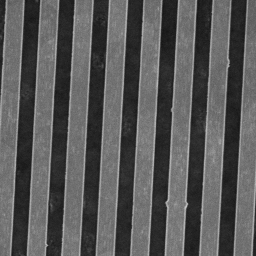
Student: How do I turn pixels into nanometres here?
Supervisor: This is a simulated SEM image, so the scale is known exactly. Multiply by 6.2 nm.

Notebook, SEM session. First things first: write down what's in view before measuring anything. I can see parallel lines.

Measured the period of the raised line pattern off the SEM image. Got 0.213 um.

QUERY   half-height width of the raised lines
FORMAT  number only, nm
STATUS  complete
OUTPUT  109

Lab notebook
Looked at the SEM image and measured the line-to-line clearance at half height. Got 0.103 µm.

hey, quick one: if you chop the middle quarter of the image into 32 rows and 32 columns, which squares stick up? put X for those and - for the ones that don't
--XXXX-----XXXX----XXXXX----XXXX
--XXXX-----XXXX----XXXX-----XXXX
--XXXX----XXXXX----XXXX-----XXXX
--XXXX----XXXXX----XXXX-----XXXX
--XXXX----XXXXX----XXXX-----XXXX
--XXXX----XXXXX----XXXX-----XXXX
--XXXX----XXXXX----XXXX-----XXXX
--XXXX----XXXXX----XXXX-----XXXX
--XXXX----XXXXX----XXXX----XXXXX
--XXXX----XXXX-----XXXX----XXXXX
-XXXXX----XXXX-----XXXX----XXXXX
-XXXXX----XXXX-----XXXX----XXXX-
-XXXXX----XXXX-----XXXX----XXXX-
-XXXXX----XXXX-----XXXX----XXXX-
-XXXXX----XXXX-----XXXX----XXXX-
-XXXXX----XXXX-----XXXX----XXXX-
-XXXXX----XXXX----XXXXX----XXXX-
-XXXX-----XXXX----XXXXX----XXXX-
-XXXX-----XXXX----XXXXX----XXXX-
-XXXX-----XXXX----XXXXX----XXXX-
-XXXX-----XXXX----XXXX-----XXXX-
-XXXX-----XXXX----XXXX-----XXXX-
-XXXX-----XXXX----XXXX-----XXXX-
-XXXX-----XXXX----XXXX-----XXXX-
-XXXX----XXXXX----XXXX-----XXXX-
-XXXX----XXXXX----XXXX-----XXXX-
-XXXX----XXXXX----XXXX-----XXXX-
-XXXX----XXXXX----XXXX----XXXXX-
-XXXX----XXXX-----XXXX----XXXXX-
XXXXX----XXXX-----XXXX----XXXXX-
XXXXX----XXXX-----XXXX----XXXX--
XXXXX----XXXX-----XXXX----XXXX--